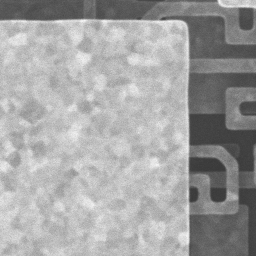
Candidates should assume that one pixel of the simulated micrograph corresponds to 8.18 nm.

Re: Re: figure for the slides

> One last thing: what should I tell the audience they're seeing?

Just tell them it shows wiring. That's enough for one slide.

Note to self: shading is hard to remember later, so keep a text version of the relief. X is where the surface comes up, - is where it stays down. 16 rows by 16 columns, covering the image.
----------------
XXXXXXXXXXX-----
XXXXXXXXXXXX----
XXXXXXXXXXXX----
XXXXXXXXXXXX----
XXXXXXXXXXXX----
XXXXXXXXXXXX----
XXXXXXXXXXXX----
XXXXXXXXXXXX----
XXXXXXXXXXXX----
XXXXXXXXXXXX----
XXXXXXXXXXXX----
XXXXXXXXXXXX----
XXXXXXXXXXXX----
XXXXXXXXXXXX----
XXXXXXXXXXXX----